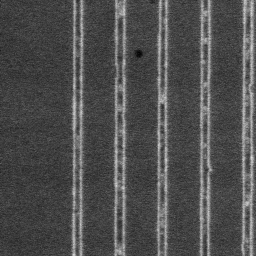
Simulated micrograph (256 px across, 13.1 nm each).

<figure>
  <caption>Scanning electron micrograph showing parallel lines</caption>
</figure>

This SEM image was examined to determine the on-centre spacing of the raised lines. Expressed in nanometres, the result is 557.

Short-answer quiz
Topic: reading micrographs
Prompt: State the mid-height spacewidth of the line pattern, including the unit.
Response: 459 nm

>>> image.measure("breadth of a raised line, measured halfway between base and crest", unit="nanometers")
91.8